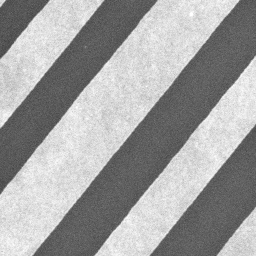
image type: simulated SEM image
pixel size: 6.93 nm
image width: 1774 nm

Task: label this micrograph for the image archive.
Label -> lines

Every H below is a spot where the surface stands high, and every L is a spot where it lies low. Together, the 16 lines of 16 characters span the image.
LLLHHHLLLHHHHHHL
LLHHHLLLLHHHHHLL
LHHHHLLLHHHHHLLL
HHHHLLLHHHHHLLLL
HHHLLLHHHHHLLLLH
HHLLLHHHHHHLLLHH
HLLLLHHHHHLLLLHH
LLLLHHHHHLLLLHHH
LLLHHHHHLLLLHHHL
LLHHHHHLLLLHHHHL
LHHHHHLLLLHHHHLL
LHHHHHLLLLHHHLLL
HHHHHLLLLHHHLLLL
HHHHLLLLHHHLLLLL
HHHLLLLHHHHLLLLH
HHLLLLHHHHLLLLHH